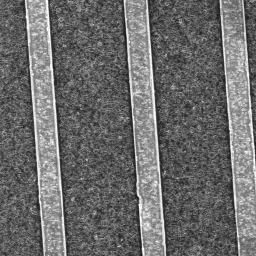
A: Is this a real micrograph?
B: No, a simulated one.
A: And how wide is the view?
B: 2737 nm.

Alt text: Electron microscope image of one or a few lines or trenches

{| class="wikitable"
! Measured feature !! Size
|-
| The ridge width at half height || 240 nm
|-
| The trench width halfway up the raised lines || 796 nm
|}